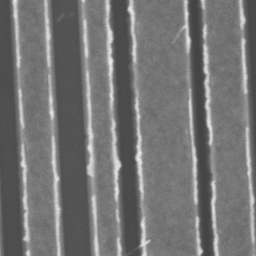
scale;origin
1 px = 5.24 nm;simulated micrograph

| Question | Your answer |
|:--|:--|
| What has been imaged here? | one or a few lines or trenches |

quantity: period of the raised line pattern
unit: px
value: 63.9